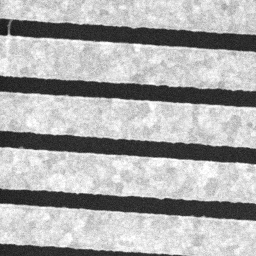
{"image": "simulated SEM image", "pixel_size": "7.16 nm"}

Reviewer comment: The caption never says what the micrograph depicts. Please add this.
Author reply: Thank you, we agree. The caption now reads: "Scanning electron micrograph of lines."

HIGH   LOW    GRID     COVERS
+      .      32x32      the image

++++++++++++++++++++++++++++++++
++++++++++++++++++++++++++++++++
...+++++++++++++++++++++++++++++
....................++++++++++++
++..............................
++++++++++++++++................
++++++++++++++++++++++++++++++++
++++++++++++++++++++++++++++++++
++++++++++++++++++++++++++++++++
..++++++++++++++++++++++++++++++
...................+++++++++++++
................................
+++++++++++++++++...............
++++++++++++++++++++++++++++++++
++++++++++++++++++++++++++++++++
++++++++++++++++++++++++++++++++
....++++++++++++++++++++++++++++
.................+++++++++++++++
++..............................
++++++++++++++++................
++++++++++++++++++++++++++++++..
++++++++++++++++++++++++++++++++
++++++++++++++++++++++++++++++++
++++++++++++++++++++++++++++++++
.................+++++++++++++++
................................
++++++++++++++..................
++++++++++++++++++++++++++++++..
++++++++++++++++++++++++++++++++
++++++++++++++++++++++++++++++++
..++++++++++++++++++++++++++++++
.................+++++++++++++++